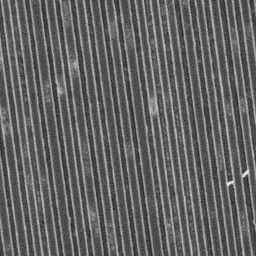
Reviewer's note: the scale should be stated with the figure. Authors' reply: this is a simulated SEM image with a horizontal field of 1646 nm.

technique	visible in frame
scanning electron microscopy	parallel lines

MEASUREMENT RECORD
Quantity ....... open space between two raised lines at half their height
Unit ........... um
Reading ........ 0.0382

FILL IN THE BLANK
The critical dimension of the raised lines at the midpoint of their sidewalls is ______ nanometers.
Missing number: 56.6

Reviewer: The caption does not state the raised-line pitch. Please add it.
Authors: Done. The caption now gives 95.3 nm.